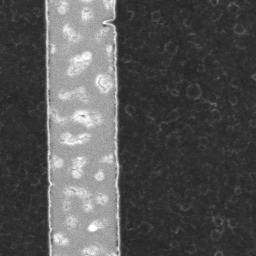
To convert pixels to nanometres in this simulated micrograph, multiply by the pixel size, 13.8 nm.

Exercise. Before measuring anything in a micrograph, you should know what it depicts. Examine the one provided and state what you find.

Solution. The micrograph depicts one or a few lines or trenches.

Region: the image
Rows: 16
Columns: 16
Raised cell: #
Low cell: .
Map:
###....#########
###....#########
###....#########
###....#########
###....#########
###....#########
###....#########
###....#########
###....#########
###....#########
###....#########
###....#########
###....#########
###....#########
###....#########
###....#########